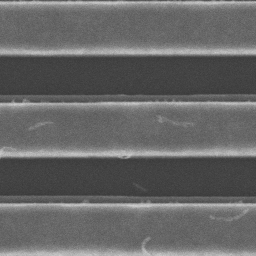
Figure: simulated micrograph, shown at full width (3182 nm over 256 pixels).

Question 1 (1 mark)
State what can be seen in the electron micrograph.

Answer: lines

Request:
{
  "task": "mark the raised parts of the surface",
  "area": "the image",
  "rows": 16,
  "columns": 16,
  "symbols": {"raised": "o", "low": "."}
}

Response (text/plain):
oooooooooooooooo
oooooooooooooooo
oooooooooooooooo
................
................
................
oooooooooooooooo
oooooooooooooooo
oooooooooooooooo
oooooooooooooooo
................
................
oooooooooooooooo
oooooooooooooooo
oooooooooooooooo
oooooooooooooooo